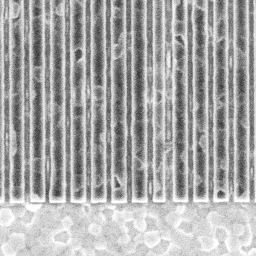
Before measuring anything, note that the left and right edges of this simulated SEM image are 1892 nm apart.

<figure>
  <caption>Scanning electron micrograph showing parallel lines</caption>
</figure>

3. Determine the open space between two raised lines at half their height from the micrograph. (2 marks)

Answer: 48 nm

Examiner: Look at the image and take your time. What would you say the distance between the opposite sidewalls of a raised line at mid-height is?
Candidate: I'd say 0.103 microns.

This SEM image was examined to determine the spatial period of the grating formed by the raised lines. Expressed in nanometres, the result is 151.